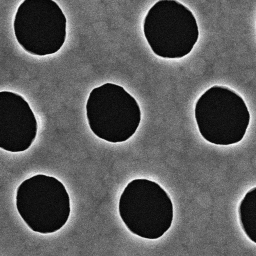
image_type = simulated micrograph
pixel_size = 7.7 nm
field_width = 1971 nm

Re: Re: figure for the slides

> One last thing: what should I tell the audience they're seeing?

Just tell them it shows holes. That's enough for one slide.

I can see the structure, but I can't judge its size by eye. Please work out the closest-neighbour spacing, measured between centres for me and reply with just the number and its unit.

0.786 microns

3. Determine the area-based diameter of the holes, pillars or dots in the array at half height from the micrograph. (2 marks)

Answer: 56.2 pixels